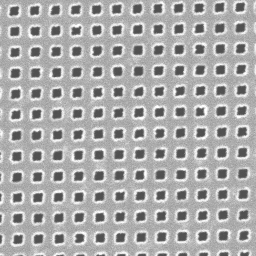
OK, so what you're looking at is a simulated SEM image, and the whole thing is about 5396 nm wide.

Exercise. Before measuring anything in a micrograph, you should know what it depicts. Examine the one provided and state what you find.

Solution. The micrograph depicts a regular array of holes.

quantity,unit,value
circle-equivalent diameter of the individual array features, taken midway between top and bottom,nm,222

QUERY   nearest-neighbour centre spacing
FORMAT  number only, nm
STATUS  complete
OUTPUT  431